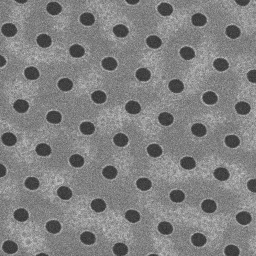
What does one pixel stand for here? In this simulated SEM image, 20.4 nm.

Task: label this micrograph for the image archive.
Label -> a regular array of holes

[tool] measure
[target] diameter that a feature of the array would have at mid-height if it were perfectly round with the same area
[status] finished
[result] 311 nm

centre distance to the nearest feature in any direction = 699 nanometers